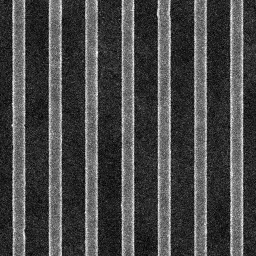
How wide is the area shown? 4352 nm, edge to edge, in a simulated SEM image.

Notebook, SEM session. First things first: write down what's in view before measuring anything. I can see parallel lines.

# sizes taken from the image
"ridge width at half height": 208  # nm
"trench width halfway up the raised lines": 412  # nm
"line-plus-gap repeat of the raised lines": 618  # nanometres